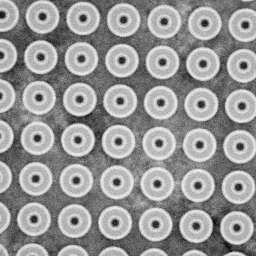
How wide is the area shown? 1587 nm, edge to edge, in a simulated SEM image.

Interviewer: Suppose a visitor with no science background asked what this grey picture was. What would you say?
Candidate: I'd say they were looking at an array of small figures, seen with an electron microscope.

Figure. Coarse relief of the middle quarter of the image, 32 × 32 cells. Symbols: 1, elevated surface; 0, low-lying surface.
01111111000111111100011111111001
01111110000111111100011111110001
00011100000011111000001111110001
00000000000000000000000111000000
00000000000000000000000000000000
00111100000011110000000000000000
01111110000111111000011111100000
11111111001111111100011111110001
11111111001111111100111111110001
11111111001111111100111111110011
11111111001111111100111111110011
01111110000111111100011111110011
00111100000111111000011111100001
00000000000000000000000111000000
00000000000000000000000000000000
01111100000011100000000000000000
11111110000111111000011111000000
11111110001111111000111111100001
11111111001111111100111111110011
11111111001111111100111111110011
11111110001111111100111111110011
11111110001111111000111111110011
01111100000111110000011111100011
00000000000001000000001111000001
00000000000000000000000000000000
01111000000001000000000000000000
11111100001111110000011111000000
11111110001111111000111111100001
11111110011111111001111111100011
11111110011111111001111111100011
11111110011111111001111111100111
11111100001111111000111111100011